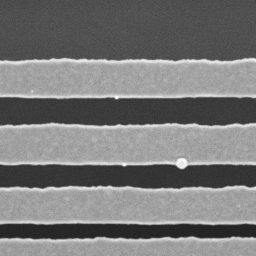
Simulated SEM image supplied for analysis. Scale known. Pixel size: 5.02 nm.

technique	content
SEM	lines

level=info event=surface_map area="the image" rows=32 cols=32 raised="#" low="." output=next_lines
................................
................................
................................
................................
................................
................................
................................
....#########...#####...##....##
################################
################################
################################
################################
................................
................................
................................
.....###............#####....#.#
################################
################################
################################
################################
######.############..######..###
................................
................................
.##...###########.......##..####
################################
################################
################################
################################
................................
................................
################################
################################